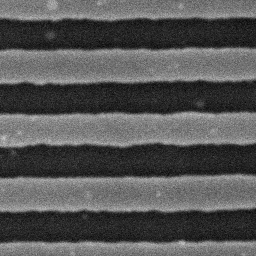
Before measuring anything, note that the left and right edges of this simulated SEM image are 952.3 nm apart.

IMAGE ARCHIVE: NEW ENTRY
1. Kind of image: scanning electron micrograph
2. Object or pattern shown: lines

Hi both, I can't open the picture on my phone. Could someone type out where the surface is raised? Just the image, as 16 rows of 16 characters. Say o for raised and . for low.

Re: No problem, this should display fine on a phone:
oooooooooooooooo
................
................
oooooooooooooooo
oooooooooooooooo
................
................
oooooooooooooooo
oooooooooooooooo
................
................
oooooooooooooooo
oooooooooooooooo
................
................
oooooooooooooooo